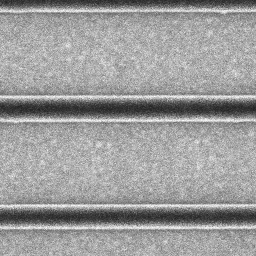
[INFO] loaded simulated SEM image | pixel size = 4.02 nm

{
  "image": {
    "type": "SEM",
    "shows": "one or a few lines or trenches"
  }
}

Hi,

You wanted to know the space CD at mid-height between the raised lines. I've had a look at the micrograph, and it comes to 0.337 um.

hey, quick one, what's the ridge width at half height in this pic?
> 100 nm